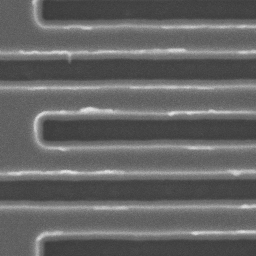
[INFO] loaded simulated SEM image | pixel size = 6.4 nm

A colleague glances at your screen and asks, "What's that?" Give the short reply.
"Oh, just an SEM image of parallel lines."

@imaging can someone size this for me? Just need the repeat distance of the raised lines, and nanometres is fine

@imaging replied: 385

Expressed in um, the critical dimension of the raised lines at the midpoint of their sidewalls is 0.21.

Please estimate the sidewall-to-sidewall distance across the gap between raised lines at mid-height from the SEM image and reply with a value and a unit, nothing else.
0.174 µm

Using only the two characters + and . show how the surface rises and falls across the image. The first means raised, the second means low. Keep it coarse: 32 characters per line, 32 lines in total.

+++++...........................
+++++...........................
+++++...........................
++++++++++++++++++++++++++++++++
++++++++++++++++++++++++++++++++
++++++++++++++++++++++++++++++++
++++++++++++++++++++++++++++++++
................................
................................
................................
..............+++...++++++..++++
++++++++++++++++++++++++++++++++
++++++++++++++++++++++++++++++++
++++++++++++++++++++++++++++++++
++++++++++......++++............
+++++...........................
+++++...........................
+++++...........................
++++++++++++++++++++++++++++++++
++++++++++++++++++++++++++++++++
++++++++++++++++++++++++++++++++
++++++++++++++++++++++++++++++++
................................
................................
................................
..++......................++++++
++++++++++++++++++++++++++++++++
++++++++++++++++++++++++++++++++
++++++++++++++++++++++++++++++++
+++++++++.+....+++++++..++......
+++++...........................
+++++...........................